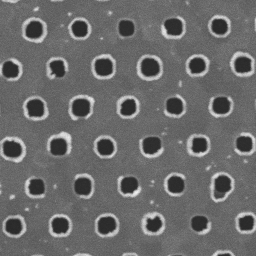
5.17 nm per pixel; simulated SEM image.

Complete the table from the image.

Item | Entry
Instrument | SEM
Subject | a regular array of holes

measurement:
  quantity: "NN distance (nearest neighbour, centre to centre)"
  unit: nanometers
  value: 232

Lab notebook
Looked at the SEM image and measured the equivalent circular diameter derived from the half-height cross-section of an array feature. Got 16.8 px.